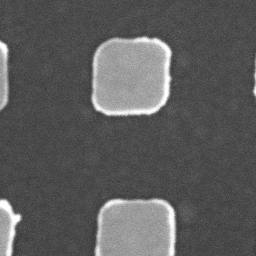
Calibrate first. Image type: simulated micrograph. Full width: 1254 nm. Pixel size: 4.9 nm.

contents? raised bodies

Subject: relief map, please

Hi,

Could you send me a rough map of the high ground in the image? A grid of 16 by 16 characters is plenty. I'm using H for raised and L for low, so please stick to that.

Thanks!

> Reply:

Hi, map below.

LLLLLLLLLLLLLLLL
LLLLLLLLLLLLLLLL
LLLLLLLHHHLLLLLL
LLLLLLHHHHHLLLLL
LLLLLLHHHHHLLLLL
LLLLLLHHHHHLLLLL
LLLLLLHHHHLLLLLL
LLLLLLLLLLLLLLLL
LLLLLLLLLLLLLLLL
LLLLLLLLLLLLLLLL
LLLLLLLLLLLLLLLL
LLLLLLLLLLLLLLLL
LLLLLLLLLLLLLLLL
HLLLLLHHHHHLLLLL
HLLLLLHHHHHLLLLL
HLLLLLHHHHHLLLLL